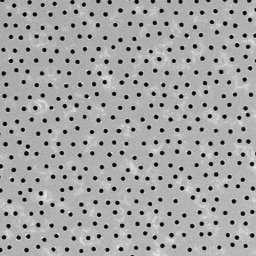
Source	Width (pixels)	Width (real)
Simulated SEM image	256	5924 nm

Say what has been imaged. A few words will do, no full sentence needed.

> a regular array of holes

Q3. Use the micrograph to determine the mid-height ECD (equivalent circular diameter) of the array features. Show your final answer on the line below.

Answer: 0.101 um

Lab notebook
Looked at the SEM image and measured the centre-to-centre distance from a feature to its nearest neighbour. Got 259 nm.